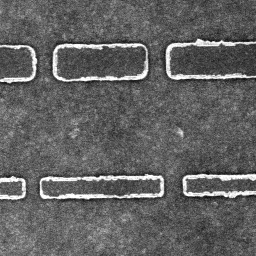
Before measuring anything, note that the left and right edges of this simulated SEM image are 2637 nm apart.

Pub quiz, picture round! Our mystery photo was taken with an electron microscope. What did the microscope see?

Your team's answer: one or a few lines or trenches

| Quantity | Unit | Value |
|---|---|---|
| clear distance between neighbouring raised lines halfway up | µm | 1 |